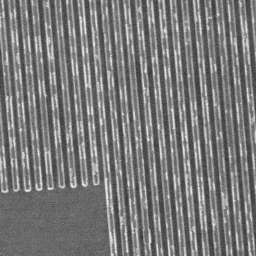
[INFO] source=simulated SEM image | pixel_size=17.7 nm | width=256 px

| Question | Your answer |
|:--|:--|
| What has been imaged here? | parallel lines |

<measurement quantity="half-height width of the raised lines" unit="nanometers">86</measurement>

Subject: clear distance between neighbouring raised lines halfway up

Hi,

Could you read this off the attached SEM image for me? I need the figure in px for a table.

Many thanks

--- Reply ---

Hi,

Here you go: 5.85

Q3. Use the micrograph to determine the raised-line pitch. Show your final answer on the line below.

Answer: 203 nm